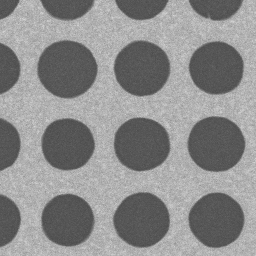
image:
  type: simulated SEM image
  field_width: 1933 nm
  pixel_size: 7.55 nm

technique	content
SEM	a regular array of holes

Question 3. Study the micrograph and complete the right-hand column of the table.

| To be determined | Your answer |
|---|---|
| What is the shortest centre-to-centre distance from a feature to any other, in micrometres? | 0.561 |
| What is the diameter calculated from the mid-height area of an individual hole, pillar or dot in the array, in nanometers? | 421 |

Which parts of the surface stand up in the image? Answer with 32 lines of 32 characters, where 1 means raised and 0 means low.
00111000000011100000011100000011
00111100000111100000111100000011
11111110011111111111111111101111
11111111111111111111111111111111
11111111111111111111111111111111
01111100001111110001111111000111
00111000000111100000011100000011
00111000000011000000011100000011
00011000000011000000011100000011
00111000000011000000011100000011
00111000000011100000011100000011
01111100000111110000111111000111
11111111111111111111111111111111
11111111111111111111111111111111
11111111111111111111111111111111
00111100000111100000111100000111
00111000000111000000011100000011
00011000000011000000011100000001
00011000000011000000011100000001
00111000000011100000011100000011
00111100000111100000111110000111
11111111111111111011111111111111
11111111111111111111111111111111
11111111111111111111111111111111
01111110001111110000111111000111
00111100000111100000011100000011
00011000000011000000011100000011
00011000000011000000011100000001
00111000000011000000011100000011
00111100000111100000011100000011
01111110001111110001111110000111
11111111111111111111111111111111